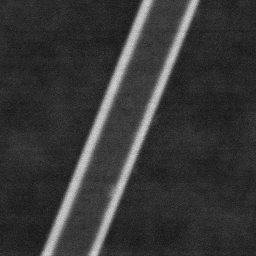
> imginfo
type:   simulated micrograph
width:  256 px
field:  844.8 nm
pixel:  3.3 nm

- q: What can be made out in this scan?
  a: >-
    one or a few lines or trenches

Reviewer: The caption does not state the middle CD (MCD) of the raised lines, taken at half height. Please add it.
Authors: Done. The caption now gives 44 px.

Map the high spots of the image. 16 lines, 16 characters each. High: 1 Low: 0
0000000001110000
0000000001110000
0000000011100000
0000000011100000
0000000111000000
0000000111000000
0000000111000000
0000001110000000
0000001110000000
0000011100000000
0000011100000000
0000011100000000
0000111000000000
0000111000000000
0001110000000000
0001110000000000